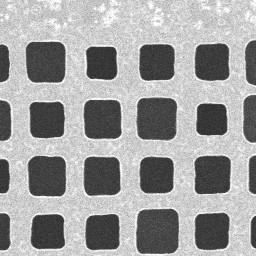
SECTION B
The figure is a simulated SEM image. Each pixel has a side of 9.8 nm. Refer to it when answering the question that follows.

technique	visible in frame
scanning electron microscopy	a regular array of holes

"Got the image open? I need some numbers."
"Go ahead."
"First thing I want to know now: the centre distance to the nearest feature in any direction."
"538 nanometres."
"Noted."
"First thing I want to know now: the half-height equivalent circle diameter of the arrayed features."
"387 nm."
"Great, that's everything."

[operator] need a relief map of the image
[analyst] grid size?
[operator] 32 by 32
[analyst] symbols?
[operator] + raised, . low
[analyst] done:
++++++++++++++++++++++++++++++++
++++++++++++++++++++++++++++++++
++++++++++++++++++++++++++++++++
++++++++++++++++++++++++++++++++
++++++++++++++++++++++++++++++++
++++....+++++++++++..+++++..+++.
.++.....+++....++.....++.....++.
.++.....+++....++.....++.....++.
.++.....+++....++.....++.....++.
.++.....+++...++++....+++....++.
+++++++++++++++++++++++++++++++.
++++++++++++++++++++++++++++++++
+++++++++++...+++.....+++++++++.
.+++....++.....++.....+++...++..
.+++....++.....++.....+++...++..
.+++....+++....++.....+++...++..
.+++....+++....++.....+++...++..
.+++++++++++++++++...++++++++++.
++++++++++++++++++++++++++++++++
++++...++++++++++++++++++...++++
.+++....++.....+++....++.....++.
.+++....++.....+++....++.....++.
.+++....++.....+++....++.....++.
.+++....++.....+++....++.....++.
+++++..+++++++++++++++++++++++++
++++++++++++++++++++++++++++++++
+++++++++++++++++.....++++++++++
.+++....+++....++.....++.....++.
.+++....+++....++.....++.....++.
.+++....+++....++.....++.....++.
.+++....+++....++.....++.....++.
+++++++++++++++++.....++++++++++